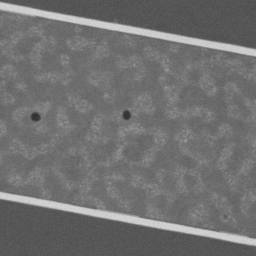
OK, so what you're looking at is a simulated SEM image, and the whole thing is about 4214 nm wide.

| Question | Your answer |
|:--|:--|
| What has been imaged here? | one or a few lines or trenches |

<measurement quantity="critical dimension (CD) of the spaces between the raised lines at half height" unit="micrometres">3.06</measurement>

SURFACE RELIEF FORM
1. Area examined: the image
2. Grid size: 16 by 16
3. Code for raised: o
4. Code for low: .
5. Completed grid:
.ooooooooooooooo
......oooooooooo
...........ooooo
................
................
................
................
................
................
................
................
................
oo..............
ooooooo.........
ooooooooooooo...
oooooooooooooooo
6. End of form